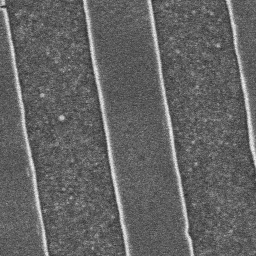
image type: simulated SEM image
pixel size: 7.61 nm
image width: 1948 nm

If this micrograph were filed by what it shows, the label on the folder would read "one or a few lines or trenches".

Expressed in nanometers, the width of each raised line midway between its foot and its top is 488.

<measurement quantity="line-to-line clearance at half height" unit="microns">0.594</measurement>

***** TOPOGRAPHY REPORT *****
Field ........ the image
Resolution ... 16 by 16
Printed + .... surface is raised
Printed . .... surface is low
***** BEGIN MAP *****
.....++++.....++
......++++.....+
+.....++++.....+
+.....++++.....+
+.....++++.....+
+.....++++.....+
+.....++++.....+
+.....+++++.....
++.....++++.....
++.....++++.....
++.....++++.....
++.....++++.....
++.....++++.....
+++.....++++....
+++.....++++....
+++.....++++....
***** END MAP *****